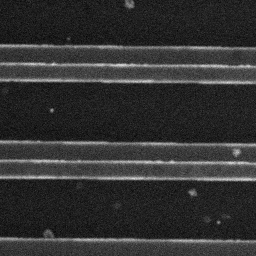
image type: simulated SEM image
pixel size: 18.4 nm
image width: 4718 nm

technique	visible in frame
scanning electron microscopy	lines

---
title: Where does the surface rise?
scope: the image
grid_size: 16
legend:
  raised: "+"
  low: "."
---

................
................
................
++++++++++++++++
++++++++++++++++
................
................
................
................
++++++++++++++++
++++++++++++++++
................
................
................
................
++++++++++++++++